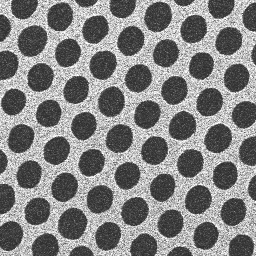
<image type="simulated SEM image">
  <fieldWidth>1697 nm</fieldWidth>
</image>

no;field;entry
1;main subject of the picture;a regular array of holes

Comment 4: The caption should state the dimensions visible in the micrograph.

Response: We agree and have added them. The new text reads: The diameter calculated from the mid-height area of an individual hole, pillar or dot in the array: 27.5 px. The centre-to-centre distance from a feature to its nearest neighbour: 242 nm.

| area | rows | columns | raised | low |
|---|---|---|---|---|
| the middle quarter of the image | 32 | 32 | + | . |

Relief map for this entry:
..++++.......++++....+++..+++++.
++++++.......+++......+++++++++.
+++++++.....++++......++++++++++
++...+++...++++.......++++....++
+.....+++++++++.......+++......+
......++++++++++.....+++.......+
......++++....++....++++.......+
......+++......+++++++++.......+
......+++......++++++++++.....++
+....+++.......++++....++....+++
+++++++++......+++......++++++++
+++++++++......+++......++++++++
++++...+++....++++......++++....
+++.....+++++++++.......+++.....
++......++++++++++.....++++.....
++......+++++...+++....+++......
++......+++......+++++++++......
++.....++++......+++++++++......
+++...++++.......++++....++....+
.+++++++++.......+++......++++++
..+++++++++......++.......++++++
.+++++..+++.....+++.......+++++.
.+++......+++++++++.......+++...
.+++......+++++++++......++++...
++++......++++++.+++.....+++....
++++......++++....++++++++++....
++++.....++++......+++++++++....
..+++...+++++......+++++..+++...
...++++++++++......++++....+++++
...++++++++++......+++......++++
....++++..++++....+++.......++++
...+++......+++++++++.......+++.